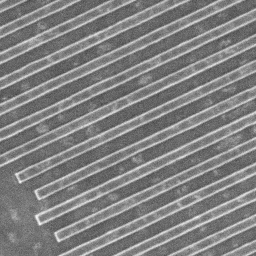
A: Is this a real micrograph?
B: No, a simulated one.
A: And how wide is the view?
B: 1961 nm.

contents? parallel lines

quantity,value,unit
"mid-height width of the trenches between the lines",102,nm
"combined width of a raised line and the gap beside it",178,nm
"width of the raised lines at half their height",75.3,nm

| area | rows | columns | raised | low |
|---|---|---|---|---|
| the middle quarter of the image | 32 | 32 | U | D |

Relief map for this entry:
DDDDUUUUUUDDDDDDDDUUUUUDDDDDDDDU
DDUUUUUUDDDDDDDDUUUUUDDDDDDDDUUU
UUUUUUDDDDDDDDUUUUUDDDDDDDDUUUUU
UUUDDDDDDDDUUUUUUDDDDDDDDUUUUUUD
UDDDDDDDDUUUUUUDDDDDDDDUUUUUUDDD
DDDDDDDUUUUUUDDDDDDDDUUUUUDDDDDD
DDDDDUUUUUUDDDDDDDDUUUUUUDDDDDDD
DDDUUUUUUDDDDDDDDUUUUUUDDDDDDDDU
DUUUUUDDDDDDDDUUUUUUDDDDDDDDUUUU
UUUUDDDDDDDDUUUUUUDDDDDDDDUUUUUU
UUDDDDDDDDUUUUUUDDDDDDDDUUUUUDDD
DDDDDDDDUUUUUUDDDDDDDDUUUUUUDDDD
DDDDDDUUUUUUDDDDDDDDUUUUUDDDDDDD
DDDDUUUUUUDDDDDDDDUUUUUDDDDDDDDU
DDUUUUUUDDDDDDDDUUUUUDDDDDDDDUUU
UUUUUDDDDDDDDDUUUUUDDDDDDDDUUUUU
UUUDDDDDDDDDUUUUUDDDDDDDDUUUUUUD
UDDDDDDDDUUUUUDDDDDDDDDUUUUUDDDD
DDDDDDDUUUUUUDDDDDDDDUUUUUDDDDDD
DDDDDUUUUUDDDDDDDDDUUUUUDDDDDDDD
DDDUUUUUDDDDDDDDDUUUUUDDDDDDDDUU
DUUUUUDDDDDDDDUUUUUDDDDDDDDDUUUU
UUUUDDDDDDDDUUUUUUDDDDDDDDUUUUUD
UUDDDDDDDDUUUUUUDDDDDDDDUUUUUDDD
DDDDDDDDUUUUUUDDDDDDDDUUUUUDDDDD
DDDDDDUUUUUUDDDDDDDDUUUUUDDDDDDD
DDDDUUUUUDDDDDDDDUUUUUUDDDDDDDDU
DDUUUUUDDDDDDDDUUUUUUDDDDDDDDUUU
UUUUUDDDDDDDDUUUUUUDDDDDDDDUUUUU
UUUDDDDDDDDUUUUUUDDDDDDDDUUUUUDD
UDDDDDDDDUUUUUDDDDDDDDUUUUUUDDDD
DDDDDDDUUUUUDDDDDDDDUUUUUUDDDDDD